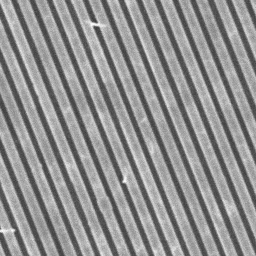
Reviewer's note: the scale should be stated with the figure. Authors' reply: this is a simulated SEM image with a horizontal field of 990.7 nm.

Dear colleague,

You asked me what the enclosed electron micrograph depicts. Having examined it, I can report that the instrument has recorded parallel lines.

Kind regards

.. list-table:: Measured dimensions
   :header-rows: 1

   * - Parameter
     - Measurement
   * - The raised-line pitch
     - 0.0642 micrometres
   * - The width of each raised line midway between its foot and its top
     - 38.6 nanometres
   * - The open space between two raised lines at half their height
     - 24.7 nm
